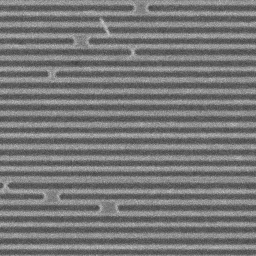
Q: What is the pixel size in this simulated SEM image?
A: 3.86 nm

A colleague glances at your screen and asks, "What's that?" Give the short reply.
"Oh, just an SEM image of parallel lines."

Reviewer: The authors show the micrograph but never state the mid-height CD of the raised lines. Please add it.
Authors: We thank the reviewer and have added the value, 16.9 nm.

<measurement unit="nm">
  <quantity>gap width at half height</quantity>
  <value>27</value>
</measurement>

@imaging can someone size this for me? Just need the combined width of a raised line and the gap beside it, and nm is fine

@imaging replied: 42.8